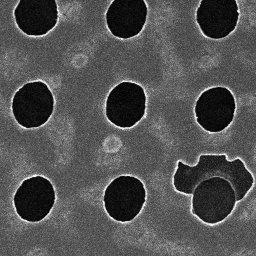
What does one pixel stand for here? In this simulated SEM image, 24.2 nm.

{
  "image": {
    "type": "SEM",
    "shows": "holes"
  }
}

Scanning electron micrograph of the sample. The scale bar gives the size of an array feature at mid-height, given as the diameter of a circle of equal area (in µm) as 1.04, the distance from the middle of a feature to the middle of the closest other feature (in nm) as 2170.